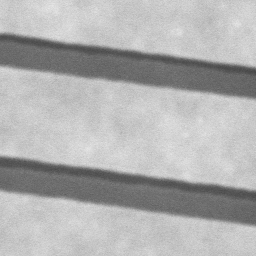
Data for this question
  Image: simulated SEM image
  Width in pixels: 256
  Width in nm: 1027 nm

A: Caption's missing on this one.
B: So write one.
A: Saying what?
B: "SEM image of lines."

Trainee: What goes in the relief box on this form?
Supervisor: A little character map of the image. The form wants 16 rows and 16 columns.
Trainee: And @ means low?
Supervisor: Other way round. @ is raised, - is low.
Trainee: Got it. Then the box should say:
@@@@@@@@@@@@@@@@
@@@@@@@@@@@@@@@@
---@@@@@@@@@@@@@
-----------@@@@@
@@@-------------
@@@@@@@@@@------
@@@@@@@@@@@@@@@@
@@@@@@@@@@@@@@@@
@@@@@@@@@@@@@@@@
@@@@@@@@@@@@@@@@
------@@@@@@@@@@
-------------@@@
@@@@------------
@@@@@@@@@@@-----
@@@@@@@@@@@@@@@@
@@@@@@@@@@@@@@@@